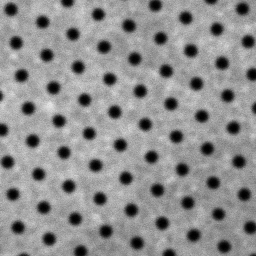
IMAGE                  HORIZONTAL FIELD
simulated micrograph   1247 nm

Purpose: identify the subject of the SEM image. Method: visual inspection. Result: a regular array of holes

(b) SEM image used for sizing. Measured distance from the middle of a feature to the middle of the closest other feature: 157 nanometres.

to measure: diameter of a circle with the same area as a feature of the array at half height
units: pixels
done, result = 13.4